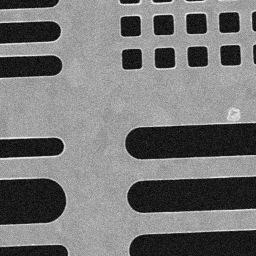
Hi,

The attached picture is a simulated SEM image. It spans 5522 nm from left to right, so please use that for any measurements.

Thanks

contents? groups of lines, slits or small figures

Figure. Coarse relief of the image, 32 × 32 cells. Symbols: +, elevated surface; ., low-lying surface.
.......++++++++..+++++++++++++++
++++++++++++++++++++++++++++.+++
+++++++++++++++...+...+...+...+.
........+++++++...+...+...+...++
.......++++++++..+++++++++++++++
..++++++++++++++++++++++++++++++
+++++++++++++++...+...+...+...++
........+++++++...+...+...++..++
........+++++++...++.+++++++++++
.......+++++++++++++++++++++++++
++++++++++++++++++++++++++++++++
++++++++++++++++++++++++++++++++
++++++++++++++++++++++++++++++++
++++++++++++++++++++++++++++++++
++++++++++++++++++++++++++++++++
++++++++++++++++++++++++++......
++++++++++++++++................
........++++++++................
........++++++++................
.......+++++++++..............++
++++++++++++++++++++++++++++++++
++++++++++++++++++++++++++++++++
.......+++++++++++..............
........++++++++................
........++++++++................
........++++++++................
........+++++++++......+++++++++
.......+++++++++++++++++++++++++
++++++++++++++++++++++++++++++++
+++++++++++++++++...............
++++++++++++++++................
........++++++++................